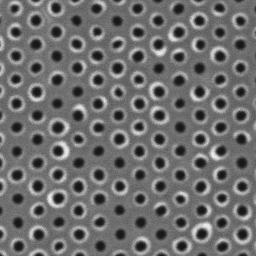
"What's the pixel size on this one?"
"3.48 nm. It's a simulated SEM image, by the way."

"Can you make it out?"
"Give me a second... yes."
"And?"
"a regular array of holes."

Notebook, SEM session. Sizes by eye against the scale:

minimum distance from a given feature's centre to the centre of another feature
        80.8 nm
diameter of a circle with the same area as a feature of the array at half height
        36.6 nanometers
